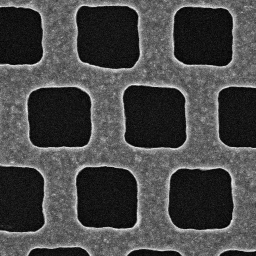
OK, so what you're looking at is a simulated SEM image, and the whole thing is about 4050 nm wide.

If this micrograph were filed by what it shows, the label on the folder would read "holes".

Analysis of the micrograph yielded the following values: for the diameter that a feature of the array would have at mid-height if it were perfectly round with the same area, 1070 nanometres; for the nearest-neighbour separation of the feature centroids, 1480 nm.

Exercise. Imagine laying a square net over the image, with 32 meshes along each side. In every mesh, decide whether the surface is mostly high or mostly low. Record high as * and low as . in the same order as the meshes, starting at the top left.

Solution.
********************************
.....*****.......*****.......***
.....****........*****.......***
.....*****.......*****.......***
.....*****.......*****.......***
.....*****.......*****.......***
.....*****.......*****.......***
.....*****.......*****.......***
**************..****************
********************************
********************************
****.......*****.......****.....
***........****........****.....
***........*****.......****.....
***........*****.......****.....
****.......*****.......****.....
****.......*****.......****.....
****.......*****.......*****....
*****.************.*************
********************************
********************************
.....*****......******.......***
......***........****........***
......****.......****........***
......****.......****........***
.....*****.......****........***
.....*****.......****........***
......****.......****........***
.....******..*..******......****
********************************
********************************
****.......*****......******....